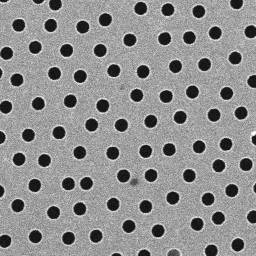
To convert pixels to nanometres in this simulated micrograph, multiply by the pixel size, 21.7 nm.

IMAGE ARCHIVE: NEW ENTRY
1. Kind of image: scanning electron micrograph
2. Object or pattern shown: a regular array of holes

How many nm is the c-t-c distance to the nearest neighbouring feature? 563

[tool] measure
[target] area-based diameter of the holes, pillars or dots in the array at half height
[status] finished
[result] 286 nm